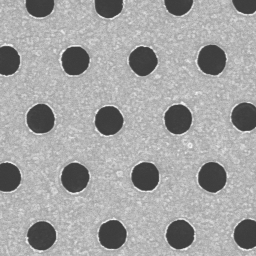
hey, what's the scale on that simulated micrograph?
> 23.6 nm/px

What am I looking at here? a regular array of holes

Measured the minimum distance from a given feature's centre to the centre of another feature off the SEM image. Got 1570 nanometres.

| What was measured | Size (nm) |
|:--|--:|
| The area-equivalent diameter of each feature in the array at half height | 692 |